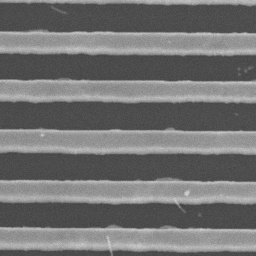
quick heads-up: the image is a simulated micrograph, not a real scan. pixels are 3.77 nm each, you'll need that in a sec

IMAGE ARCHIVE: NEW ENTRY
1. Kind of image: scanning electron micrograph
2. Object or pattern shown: lines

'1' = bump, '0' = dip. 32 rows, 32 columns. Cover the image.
00000000000000000000111111110111
00000000000000000000000000000000
00000000000000000000000000000000
00000000000000000000000000000000
11111111111111111111111111111111
11111111111111111111111111111111
11111111111111111111111111111111
00000000000000000000000000000000
00000000000000000000000000000000
00000000000000000000000000000000
11111111111111111111111111111111
11111111111111111111111111111111
11111111111111111111111111111111
00000000000000000000000000000000
00000000000000000000000000000000
00000000000000000000000000000000
11111111111111111111111111111111
11111111111111111111111111111111
11111111111111111111111111111111
00000000000000000000000000000000
00000000000000000000000000000000
00000000000000000000000000000000
00000000000000000000000000000000
11111111111111111111111111111111
11111111111111111111111111111111
00000000000000000000000000000000
00000000000000000000000000000000
00000000000000000000000000000000
11111100000000000000000000000000
11111111111111111111111111111111
11111111111111111111111111111111
00000000000000000000000000000000